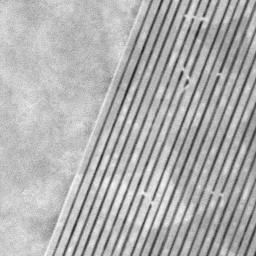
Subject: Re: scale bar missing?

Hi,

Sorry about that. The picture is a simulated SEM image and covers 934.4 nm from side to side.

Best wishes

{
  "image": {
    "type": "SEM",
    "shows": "parallel lines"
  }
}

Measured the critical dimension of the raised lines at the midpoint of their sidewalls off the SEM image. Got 0.0226 um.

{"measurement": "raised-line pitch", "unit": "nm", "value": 32.8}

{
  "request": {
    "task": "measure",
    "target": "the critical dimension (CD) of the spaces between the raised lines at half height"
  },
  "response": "2.68 px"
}